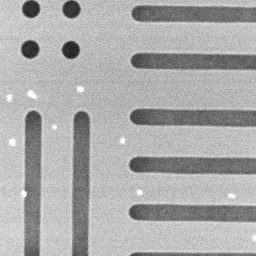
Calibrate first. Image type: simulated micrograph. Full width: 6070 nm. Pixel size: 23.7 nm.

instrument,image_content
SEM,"groups of lines, slits or small figures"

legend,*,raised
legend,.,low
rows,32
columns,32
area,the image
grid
***..***..**********************
***..***..******................
*****************...............
********************************
********************************
***..***..**********************
***..***..**********************
****************................
*****************...............
********************************
********************************
********************************
********************************
********************************
***..****..*****................
***..****..******...............
***..****..*********************
***..****..*********************
***..****..*********************
***..****..******.......********
***..****..*****................
***..****..******...............
***..****..*********************
***..****..*********************
***..****..*********************
***..****..******......*********
***..****..*****................
***..****..******...............
***..****..*********************
***..****..*********************
***..****..*********************
***..****..******....***********